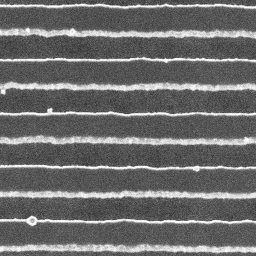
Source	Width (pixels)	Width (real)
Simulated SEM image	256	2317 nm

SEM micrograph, lines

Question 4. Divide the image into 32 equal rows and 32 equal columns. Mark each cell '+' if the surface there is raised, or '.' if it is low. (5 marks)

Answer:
................................
++++++++++++++++++++++++++++++++
++++++++++++++++++++++++++++++++
++++++++++++++++++++++++++++++++
................................
................................
................................
++++++++++++..+++++++++++++.+++.
++++++++++++++++++++++++++++++++
++++++++++++++++++++++++++++++++
++++++++++++++++++++++++++++++++
................................
................................
................................
++++++++++++++++++++++++++++++++
++++++++++++++++++++++++++++++++
++++++++++++++++++++++++++++++++
++++..++++.+++++++++++++++++++++
................................
................................
................................
++++++++++++++++++++++++++++++++
++++++++++++++++++++++++++++++++
++++++++++++++++++++++++++++++++
..........................+...+.
................................
................................
...++...........................
++++++++++++++++++++++++++++++++
++++++++++++++++++++++++++++++++
++++++++++++++++++++++++++++++++
................................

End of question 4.